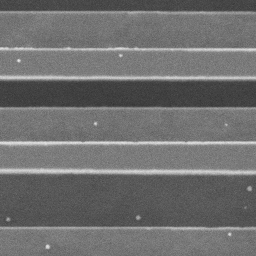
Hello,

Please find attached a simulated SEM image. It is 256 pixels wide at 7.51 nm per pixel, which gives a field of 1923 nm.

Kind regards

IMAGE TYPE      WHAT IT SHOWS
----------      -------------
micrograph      lines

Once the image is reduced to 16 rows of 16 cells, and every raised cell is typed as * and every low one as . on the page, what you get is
................
****************
****************
****************
****************
................
................
****************
****************
****************
****************
................
................
................
****************
****************